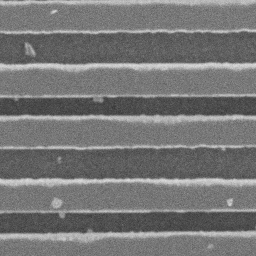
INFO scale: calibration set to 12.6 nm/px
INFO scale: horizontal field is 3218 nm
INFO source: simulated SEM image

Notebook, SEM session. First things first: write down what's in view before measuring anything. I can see lines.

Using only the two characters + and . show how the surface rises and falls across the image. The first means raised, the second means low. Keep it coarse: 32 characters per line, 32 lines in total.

++++++++++++++++++++++++++++++++
++++++++++++++++++++++++++++++++
++++++++++++++++++++++++++++++++
++++++++++++++++++++++++++++++++
................................
................................
................................
................................
++++++++++++++++++++++++++++++++
++++++++++++++++++++++++++++++++
++++++++++++++++++++++++++++++++
++++++++++++++++++++++++++++++++
................................
................................
...+.........................+..
++++++++++++++++++++++++++++++++
++++++++++++++++++++++++++++++++
++++++++++++++++++++++++++++++++
+++++++++++++++++..+............
................................
................................
................................
................................
++++++++++++++++++++++++++++++++
++++++++++++++++++++++++++++++++
++++++++++++++++++++++++++++++++
+...............................
................................
................................
++++++++++++++++++++++++++++++++
++++++++++++++++++++++++++++++++
++++++++++++++++++++++++++++++++